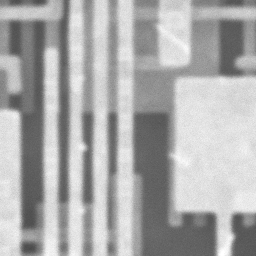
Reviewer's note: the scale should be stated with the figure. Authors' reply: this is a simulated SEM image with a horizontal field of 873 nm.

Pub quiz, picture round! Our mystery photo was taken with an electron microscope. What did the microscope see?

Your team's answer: wiring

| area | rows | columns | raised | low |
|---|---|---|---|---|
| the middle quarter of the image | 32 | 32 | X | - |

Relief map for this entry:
--XX----XXXXXXXXXXXXXXXXXXXXX---
--XX----XXX---XXX---------------
--XX----XXX---XXX---------------
--XXX---XXX---XXX------------XXX
--XX----XXX---XXX-----------XXXX
--XX----XXX---XXX-----------XXXX
--XX----XXX---XXX-----------XXXX
--XX----XXX---XXX-----------XXXX
--XX----XXX---XXX-----------XXXX
--XX----XXX---XXX-----------XXXX
--XX----XXX---XXX-----------XXXX
--XX----XXX---XXX-----------XXXX
--XX----XXX---XXX-----------XXXX
--XX----XXX---XXX-----------XXXX
--XX----XXX---XXX-----------XXXX
--XX----XXX---XXX-----------XXXX
--XX----XXX---XXX-----------XXXX
--XX----XXX---XXX-----------XXXX
--XX----XXX---XXX-----------XXXX
-XXXX---XXX---XXX-----------XXXX
-XXXX---XXX---XXX-----------XXXX
-XXXX---XXX---XXX-----------XXXX
-XXXX---XXX---XXX-----------XXXX
-XXXX---XXX---XXX-----------XXXX
-XXXX---XXX---XXX-----------XXXX
-XXXX---XXX---XXX-----------XXXX
-XXXX---XXX---XXX-----------XXXX
-XXXX---XXX---XXX-----------XXXX
-XXXX---XXX---XXX-----------XXXX
-XXX----XXX---XXX-----------XXXX
-XXX----XXX---XXX-----------XXXX
-XXX----XXX---XXX-----------XXXX